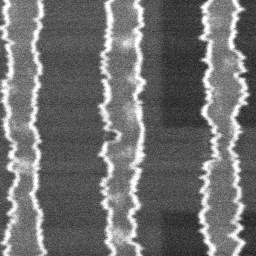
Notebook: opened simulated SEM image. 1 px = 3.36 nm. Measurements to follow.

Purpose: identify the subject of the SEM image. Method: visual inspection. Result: one or a few lines or trenches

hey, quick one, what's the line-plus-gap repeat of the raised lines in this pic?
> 99.9 px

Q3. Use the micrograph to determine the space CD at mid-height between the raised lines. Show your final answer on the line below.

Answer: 238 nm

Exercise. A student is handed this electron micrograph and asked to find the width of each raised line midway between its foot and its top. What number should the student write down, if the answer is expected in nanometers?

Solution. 97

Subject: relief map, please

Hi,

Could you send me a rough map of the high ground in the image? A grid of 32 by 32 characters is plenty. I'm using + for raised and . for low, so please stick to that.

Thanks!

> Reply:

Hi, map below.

.++++........++++.........++++..
.++++.........++++........++++..
.++++.........++++.......++++...
+++++.........+++.........+++...
+++++.........++++........+++...
.+++.........++++.........+++...
.+++.........++++.........++++..
.++++........++++.........++++..
.++++........++++.........++++..
.++++........++++.........++++..
.++++........+++++........+++++.
.+++.........++++.........+++++.
.+++.........++++.........++++..
.+++.........++++.........++++..
.+++.........++++.........+++...
.+++.........+++++........+++...
.+++..........++++.........+++..
.++++.........++++.........++...
..+++........+++++.........++...
.++++........++++..........++...
.++++.........+++.........++++..
..++..........+++.........++++..
..++.........++++.........++++..
..++.........++++........+++++..
.+++.........++++.........++++..
..++.........++++.........++++..
.++++.........+++........+++++..
.++++.........++.........+++++..
.++++........++++.........++++..
.++++.........+++.........+++...
.++++.........+++.........++++..
.+++++........+++.........++++..